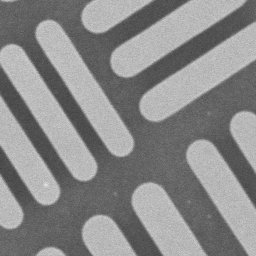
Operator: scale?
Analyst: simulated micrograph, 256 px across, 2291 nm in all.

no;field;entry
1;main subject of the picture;groups of lines, slits or small figures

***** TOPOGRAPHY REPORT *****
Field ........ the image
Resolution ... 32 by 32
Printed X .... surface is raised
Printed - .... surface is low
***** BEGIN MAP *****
-----------XXXXXXX-----XXXXXXX--
----------XXXXXXX-----XXXXXXX---
----------XXXXX-----XXXXXXX-----
-----XXX---XXX-----XXXXXXX-----X
-----XXX---------XXXXXXX-----XXX
-----XXXX------XXXXXXXX-----XXXX
XXX---XXXX----XXXXXXX-----XXXXXX
XXXX--XXXX----XXXXXX-----XXXXXXX
XXXX---XXXX---XXXX-----XXXXXXX--
-XXXX---XXXX---X-----XXXXXXXX---
--XXXX--XXXX--------XXXXXXX-----
--XXXX---XXXX-----XXXXXXXX------
---XXXX--XXXXX----XXXXXX--------
X---XXXX--XXXX----XXXXX---------
XX--XXXX---XXXX---XXX--------XXX
XX---XXXX--XXXX--------------XXX
XXX---XXXX--XXXX-------------XXX
XXXX--XXXX---XXXX------------XXX
XXXX---XXXX--XXXX-------XXX---XX
-XXXX--XXXX------------XXXXX---X
--XXXX--XXXX------------XXXX---X
--XXXX---XXX------------XXXXX---
---XXXX---X--------------XXXXX--
X--XXXX----------XXX------XXXX--
XX--XXX----------XXXX-----XXXXX-
XX---X-----------XXXXX-----XXXXX
XXX--------------XXXXX------XXXX
XXX--------XXX----XXXXX-----XXXX
-X--------XXXXX---XXXXXX-----XXX
----------XXXXX----XXXXX-----XXX
-----------XXXXX---XXXXXX-----XX
-----XXX---XXXXXX---XXXXXX-----X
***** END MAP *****